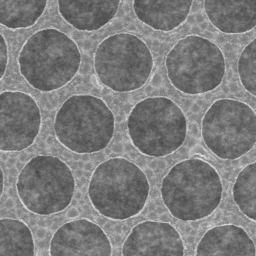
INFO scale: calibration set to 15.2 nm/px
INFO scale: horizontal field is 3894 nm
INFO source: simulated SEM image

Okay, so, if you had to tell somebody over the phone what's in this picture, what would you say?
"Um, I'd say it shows a regular array of holes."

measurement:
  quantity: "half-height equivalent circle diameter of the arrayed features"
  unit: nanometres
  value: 908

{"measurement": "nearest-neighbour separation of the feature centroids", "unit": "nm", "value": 1100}